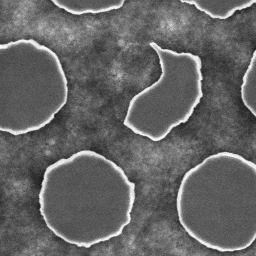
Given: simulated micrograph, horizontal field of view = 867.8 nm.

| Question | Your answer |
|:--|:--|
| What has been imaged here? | raised bodies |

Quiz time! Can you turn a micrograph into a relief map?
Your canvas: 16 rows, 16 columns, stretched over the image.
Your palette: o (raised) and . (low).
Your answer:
....ooo.....ooo.
................
................
ooo.......oo....
oooo......oo...o
oooo.....oooo..o
oooo....oooo...o
ooo.....oooo....
.........o......
................
...oooo.....oooo
...ooooo...ooooo
...ooooo...ooooo
...ooooo...ooooo
...oooo.....oooo
.............oo.